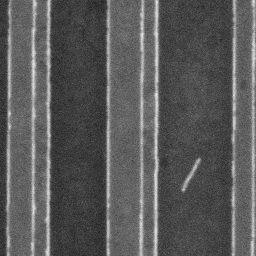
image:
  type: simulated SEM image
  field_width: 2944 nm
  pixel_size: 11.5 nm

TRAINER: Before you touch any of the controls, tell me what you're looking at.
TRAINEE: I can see lines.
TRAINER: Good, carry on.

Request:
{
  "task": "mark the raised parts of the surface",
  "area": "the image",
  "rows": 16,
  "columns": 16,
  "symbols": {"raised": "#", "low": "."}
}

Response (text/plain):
.##....###.....#
.##....###.....#
.##....###.....#
.##....###.....#
.##....###.....#
.##....###.....#
.##....###.....#
.##....###.....#
.##....###.....#
.##....###.....#
.##....###.....#
###....###.....#
###....###.....#
###....###.....#
###....###.....#
###....###.....#